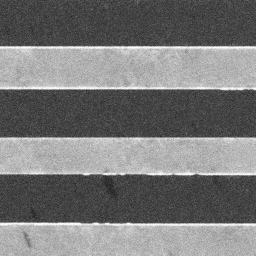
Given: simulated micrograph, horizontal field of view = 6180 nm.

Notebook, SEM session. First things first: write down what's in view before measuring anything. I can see lines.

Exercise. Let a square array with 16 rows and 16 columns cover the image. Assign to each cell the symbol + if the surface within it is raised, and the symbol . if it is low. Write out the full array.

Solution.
................
................
................
++++++++++++++++
++++++++++++++++
++++++++++++++++
................
................
................
++++++++++++++++
++++++++++++++++
................
................
................
++++++++++++++++
++++++++++++++++